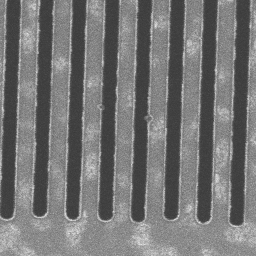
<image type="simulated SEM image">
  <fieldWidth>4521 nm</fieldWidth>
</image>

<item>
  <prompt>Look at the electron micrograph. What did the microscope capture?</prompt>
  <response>parallel lines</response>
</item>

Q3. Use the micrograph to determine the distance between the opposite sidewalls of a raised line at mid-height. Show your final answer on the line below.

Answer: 16.7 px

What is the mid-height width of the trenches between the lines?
16 pixels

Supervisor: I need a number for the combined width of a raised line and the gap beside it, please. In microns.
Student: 0.58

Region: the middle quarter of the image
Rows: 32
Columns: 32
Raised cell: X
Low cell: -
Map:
-XXXX-----XXXX----XXXX----XXXX--
-XXXX-----XXXX----XXXX----XXXX--
-XXXX-----XXXX----XXXX----XXXX--
-XXXX-----XXX-----XXXX----XXXX--
-XXXX----XXXX-----XXXX----XXXX--
-XXXX----XXXX-----XXXX----XXXX--
-XXXX----XXXX----XXXXX----XXXX--
-XXXX----XXXX----XXXXX----XXXX--
-XXXX----XXXX-----XXXX----XXXX--
-XXXX----XXXX-----XXX-----XXXX--
-XXXX----XXXX----XXXX----XXXXX--
-XXXX----XXXX----XXXX-----XXXX--
-XXXX----XXXX----XXXXX----XXXX--
-XXXX----XXXX----XXXXX----XXXX--
-XXXX----XXXX----XXXXX----XXX---
-XXXX----XXXX----XXXX----XXXX---
-XXXX----XXXX----XXXX----XXXX---
-XXXX----XXXX----XXXX----XXXX---
-XXXX----XXXX----XXXX----XXXX---
-XXXX----XXXX----XXXX----XXXX---
-XXXX----XXXX----XXXX----XXXX---
-XXXX----XXXX----XXXX----XXXX---
-XXXX----XXXX----XXXX----XXXX---
-XXXX----XXXX----XXXX----XXXX---
-XXXX----XXXX----XXXX----XXXX---
XXXXX----XXXX----XXXX----XXXX---
XXXXX----XXXX----XXXX----XXXX---
XXXXX----XXXX----XXXX----XXXX---
XXXXX----XXXX----XXXX----XXXX---
XXXX-----XXXX----XXXX----XXXX---
XXXX-----XXXX----XXXX----XXXX---
XXXX-----XXXX----XXXX----XXXX---